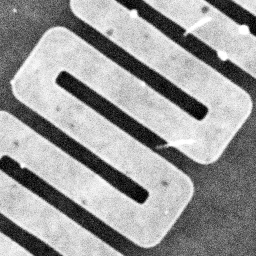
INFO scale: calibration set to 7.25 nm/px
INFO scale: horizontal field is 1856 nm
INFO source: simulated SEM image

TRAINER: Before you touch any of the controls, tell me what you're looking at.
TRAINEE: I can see groups of lines, slits or small figures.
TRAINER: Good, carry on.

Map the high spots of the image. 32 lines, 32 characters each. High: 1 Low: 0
00000000011111100001111111000011
00000000011111111000111111100001
00000000001111111100011111111000
00000001000011111110000111111110
00000111110001111111100011111111
00000111111000011111110000111111
00001111111100001111111000011111
00011111111111000011111110000111
00011111111111100001111111100011
00111110011111111000111111110000
00111110000111111100001111111000
00111111000011111111000111111110
00011111110000111111100001111110
00001111111000011111110000111110
11000111111110001111111100111110
11100001111111000011111111111100
11110000111111110001111111111000
11111100011111111000011111111000
11111110000111111100001111110000
01111111100011111111000011100000
00011111110000111111100000000000
00001111111100011111111000000000
11000111111110000111111100000000
11100001111111000011111100000000
11111000111111110001111100000000
11111100001111111011111000000000
11111110000111111111111000000000
00111111100001111111110000000000
00011111110000111111100000000000
10001111111100001111000000000000
11000011111110000110000000000000
11110001111111100000000000000000